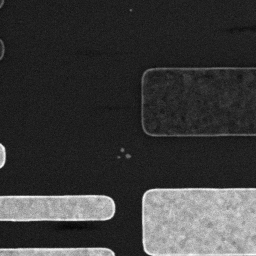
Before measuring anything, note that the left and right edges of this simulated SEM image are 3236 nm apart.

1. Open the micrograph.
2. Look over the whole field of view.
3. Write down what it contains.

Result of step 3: wiring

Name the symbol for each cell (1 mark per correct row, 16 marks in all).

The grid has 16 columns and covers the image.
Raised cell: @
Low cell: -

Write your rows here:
----------------
----------------
----------------
----------------
---------@@@@@@@
---------@@@@@@@
---------@@@@@@@
---------@@@@@@@
----------------
----------------
----------------
----------------
@@@@@@@--@@@@@@@
@@@@@@@--@@@@@@@
---------@@@@@@@
---------@@@@@@@